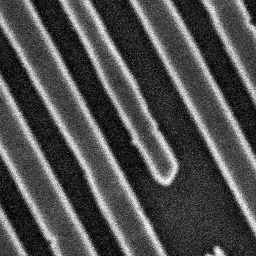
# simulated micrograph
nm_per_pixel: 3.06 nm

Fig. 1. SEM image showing one or a few lines or trenches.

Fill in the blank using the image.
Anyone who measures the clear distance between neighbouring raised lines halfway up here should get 91.9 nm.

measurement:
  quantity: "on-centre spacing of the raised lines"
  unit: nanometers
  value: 189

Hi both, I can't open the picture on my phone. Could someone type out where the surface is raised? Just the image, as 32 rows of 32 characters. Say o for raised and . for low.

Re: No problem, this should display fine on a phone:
oooo....ooo......oooo.....oooo..
oooo.....ooo.....ooooo.....oooo.
ooooo....ooo......oooo.....oooo.
.oooo.....ooo.....ooooo....ooooo
.ooooo....ooo......ooooo....oooo
..oooo.....ooo......oooo....oooo
..ooooo....ooo......ooooo....ooo
...oooo.....ooo......oooo....ooo
....oooo....oooo.....ooooo....oo
....oooo.....ooo......oooo....oo
.....oooo....oooo.....ooooo....o
o....ooooo....ooo......oooo.....
o.....oooo....oooo.....ooooo....
oo....ooooo....ooo......oooo....
oo.....oooo....oooo.....ooooo...
ooo....ooooo....ooo......oooo...
ooo.....oooo.....ooo.....ooooo..
oooo.....oooo....ooo......oooo..
ooooo....oooo.....ooo......oooo.
.oooo.....oooo....ooo......oooo.
.ooooo....oooo.....ooo......oooo
..oooo.....oooo....ooo......oooo
..ooooo....oooo.....o........ooo
...oooo.....oooo.............ooo
...ooooo....ooooo.............oo
....oooo.....oooo.............oo
....ooooo....ooooo.............o
o....oooo.....oooo.............o
o....ooooo....ooooo.............
oo....ooooo....oooo.............
oo.....oooo....ooooo............
ooo....ooooo....oooo.......o....